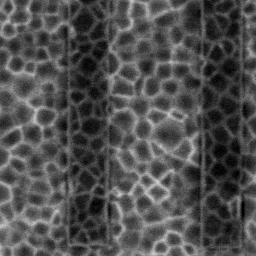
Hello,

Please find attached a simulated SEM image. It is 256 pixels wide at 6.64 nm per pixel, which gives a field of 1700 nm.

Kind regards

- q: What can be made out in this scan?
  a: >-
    one or a few lines or trenches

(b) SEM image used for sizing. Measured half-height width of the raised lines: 0.267 microns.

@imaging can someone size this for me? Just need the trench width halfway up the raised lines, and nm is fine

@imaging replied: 620